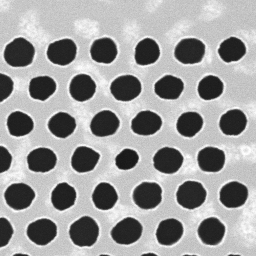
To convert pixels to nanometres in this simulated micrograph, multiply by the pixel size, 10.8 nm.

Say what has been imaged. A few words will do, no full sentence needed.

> a regular array of holes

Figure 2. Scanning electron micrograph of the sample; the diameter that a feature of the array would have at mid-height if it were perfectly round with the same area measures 292 nm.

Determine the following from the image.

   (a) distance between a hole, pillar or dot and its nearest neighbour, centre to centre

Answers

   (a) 444 nanometres